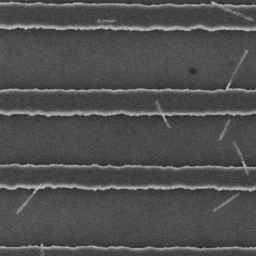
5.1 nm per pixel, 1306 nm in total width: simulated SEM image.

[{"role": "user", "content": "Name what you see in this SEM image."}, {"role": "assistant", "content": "lines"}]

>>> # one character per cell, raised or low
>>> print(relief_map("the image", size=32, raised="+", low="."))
+++++++.+++++++++...++.+.++.....
++++++++++++++++++++++++++++++++
++++++++++++++++++++++++++++++++
++.+..++++++++++++++++++++++++++
................................
................................
................................
................................
................................
................................
................................
++++++++++++++++++++++++++++++++
++++++++++++++++++++++++++++++++
++++++++++++++++++++++++++++++++
................................
................................
................................
................................
................................
................................
................................
++++++++++++++++++++++++++++++++
++++++++++++++++++++++++++++++++
++.+++....++++++++++++.+++++++++
................................
................................
................................
................................
................................
................................
................................
++++++++++++++++++++++++++++++++